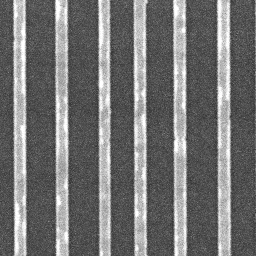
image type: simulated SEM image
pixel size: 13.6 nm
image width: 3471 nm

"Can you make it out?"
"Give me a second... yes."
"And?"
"parallel lines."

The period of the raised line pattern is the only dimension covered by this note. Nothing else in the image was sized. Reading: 553 nm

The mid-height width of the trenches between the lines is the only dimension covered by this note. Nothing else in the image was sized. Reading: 417 nm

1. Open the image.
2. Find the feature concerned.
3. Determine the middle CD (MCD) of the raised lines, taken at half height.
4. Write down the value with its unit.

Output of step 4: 149 nm